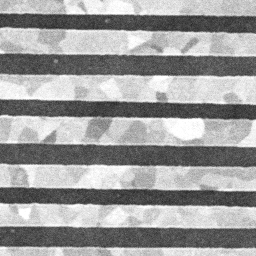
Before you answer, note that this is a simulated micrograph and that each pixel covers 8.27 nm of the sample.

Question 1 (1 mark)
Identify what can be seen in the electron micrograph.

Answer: lines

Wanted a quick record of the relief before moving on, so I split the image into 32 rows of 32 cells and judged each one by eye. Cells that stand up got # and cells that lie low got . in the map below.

################################
################################
................................
#...............................
################################
################################
################################
................................
................................
#################...............
################################
################################
...........#####################
................................
#...............................
################################
################################
################################
................................
................................
................................
################################
################################
............####################
................................
#...#...........................
################################
################################
................................
................................
................................
################################